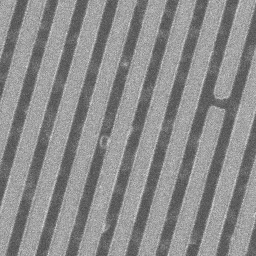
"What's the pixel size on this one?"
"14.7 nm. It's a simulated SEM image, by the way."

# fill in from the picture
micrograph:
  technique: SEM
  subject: parallel lines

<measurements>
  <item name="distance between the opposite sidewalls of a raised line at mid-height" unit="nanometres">203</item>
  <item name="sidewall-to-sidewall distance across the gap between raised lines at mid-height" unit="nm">219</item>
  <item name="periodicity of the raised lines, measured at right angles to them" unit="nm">425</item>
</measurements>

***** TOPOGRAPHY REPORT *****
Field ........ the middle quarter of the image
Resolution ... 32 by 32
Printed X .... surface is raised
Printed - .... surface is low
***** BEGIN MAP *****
XX----XXX----XXXX----XXX----XXXX
XX----XXX----XXXX---XXXX----XXXX
X----XXXX----XXX----XXXX----XXX-
X----XXXX---XXXX----XXXX---XXXX-
X----XXX----XXXX----XXX----XXXX-
----XXXX----XXX----XXXX----XXXX-
----XXXX----XXX----XXXX----XXX--
----XXX----XXXX----XXXX---XXXX--
----XXX----XXXX----XXX----XXXX--
---XXXX----XXX----XXXX----XXX---
---XXXX---XXXX----XXXX----XXX---
---XXX----XXXX----XXX----XXXX---
--XXXX----XXX-----XXX----XXXX---
--XXXX----XXX----XXXX----XXX----
--XXX----XXXX----XXXX---XXXX----
--XXX----X-XX----XXX----XXXX----
-XXXX----XXX----XXXX----XXX----X
-XXXX----XXX----XXXX----XXX----X
-XXX----XXXX----XXX----XXXX----X
-XXX----XXXX---XXXX----XXXX----X
XXXX----XXX----XXXX----XXX----XX
XXX----XXXX----XXXX---XXXX----XX
XXX----XXXX----XXX----XXXX----XX
XXX----XXX----XXXX----XXX----XXX
XXX----XXX----XXXX----XXX----XXX
XX----XXXX----XXX----XXXX----XXX
XX----XXXX---XXXX----XXXX----XXX
XX----XXX----XXXX----XXX----XXXX
XX---XXXX----XXXX----XXX----XXXX
X----XXXX----XXX----XXXX----XXX-
X----XXX----XXXX----XXXX---XXXX-
X----XXX----XXXX----XXX----XXXX-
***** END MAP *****